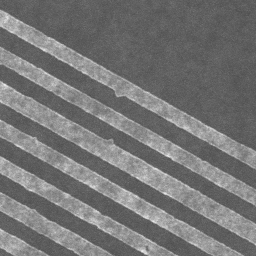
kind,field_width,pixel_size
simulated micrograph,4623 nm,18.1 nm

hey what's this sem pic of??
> parallel lines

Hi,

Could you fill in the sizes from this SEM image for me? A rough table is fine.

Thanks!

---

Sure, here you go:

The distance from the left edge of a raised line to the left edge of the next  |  0.578 µm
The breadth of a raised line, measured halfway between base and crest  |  250 nm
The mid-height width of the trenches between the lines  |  306 nm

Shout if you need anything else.